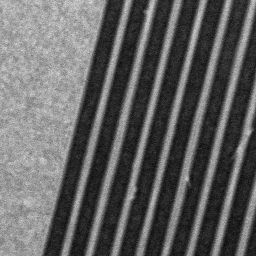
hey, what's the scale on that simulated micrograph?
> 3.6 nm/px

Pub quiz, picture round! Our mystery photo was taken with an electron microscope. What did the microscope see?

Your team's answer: parallel lines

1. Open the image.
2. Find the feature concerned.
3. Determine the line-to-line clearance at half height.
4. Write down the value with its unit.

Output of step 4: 64.1 nanometres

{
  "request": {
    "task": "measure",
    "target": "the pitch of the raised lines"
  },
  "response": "87.4 nm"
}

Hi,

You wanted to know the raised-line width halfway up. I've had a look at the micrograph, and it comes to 21.3 nm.